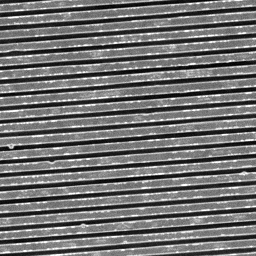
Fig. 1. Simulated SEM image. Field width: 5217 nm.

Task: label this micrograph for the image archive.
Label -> parallel lines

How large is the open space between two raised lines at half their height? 93.9 nanometers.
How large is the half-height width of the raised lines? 170 nanometres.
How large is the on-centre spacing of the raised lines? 272 nanometres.